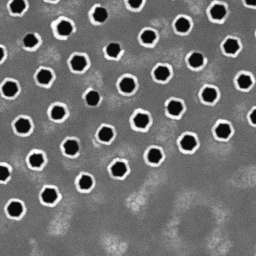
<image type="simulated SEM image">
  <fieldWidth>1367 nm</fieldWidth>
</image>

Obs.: a regular array of holes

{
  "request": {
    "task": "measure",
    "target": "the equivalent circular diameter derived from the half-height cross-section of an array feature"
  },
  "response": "80.6 nanometres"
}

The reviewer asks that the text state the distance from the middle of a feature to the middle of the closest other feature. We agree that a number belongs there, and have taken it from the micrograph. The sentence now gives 196 nm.